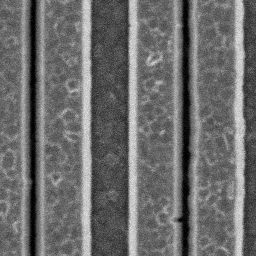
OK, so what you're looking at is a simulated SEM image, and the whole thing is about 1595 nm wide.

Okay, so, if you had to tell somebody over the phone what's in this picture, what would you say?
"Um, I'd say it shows one or a few lines or trenches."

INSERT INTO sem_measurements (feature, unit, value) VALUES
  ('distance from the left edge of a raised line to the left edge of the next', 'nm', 477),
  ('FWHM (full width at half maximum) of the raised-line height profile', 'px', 45.7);